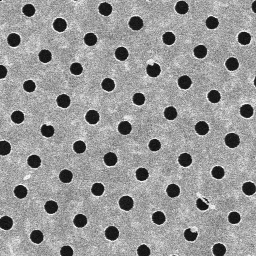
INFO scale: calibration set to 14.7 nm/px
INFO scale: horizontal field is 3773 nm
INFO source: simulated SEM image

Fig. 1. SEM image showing a regular array of holes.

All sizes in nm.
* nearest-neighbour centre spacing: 481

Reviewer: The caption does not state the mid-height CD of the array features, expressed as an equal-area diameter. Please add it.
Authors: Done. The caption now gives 202 nm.